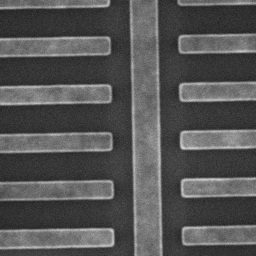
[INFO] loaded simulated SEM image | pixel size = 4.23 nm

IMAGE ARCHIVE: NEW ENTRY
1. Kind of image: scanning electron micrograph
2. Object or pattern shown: groups of lines, slits or small figures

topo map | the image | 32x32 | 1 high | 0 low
11111111111111001111001111111110
00000000000000001111000000000000
00000000000000001111000000000000
00000000000000001111000000000000
00000000000000001111000111111111
11111111111111001111001111111111
11111111111111001111000111111100
00000000000000001111000000000000
00000000000000000111000000000000
00000000000000000111000000000000
00000000000000000111000111111111
11111111111111000111001111111111
11111111111111000111000111111100
00000000000000000111000000000000
00000000000000000111000000000000
00000000000000000111000000000000
00000000000000000111000111111111
11111111111111000111000111111111
11111111111111000111000111111110
00000000000000000111000000000000
00000000000000000111000000000000
00000000000000000111000000000000
00000000000000000111000111111111
11111111111111000111000111111111
11111111111111000111000111111000
00000000000000000111000000000000
00000000000000000111000000000000
00000000000000000111000000000000
00000000000000000111000111111111
11111111111111000111000111111111
11111111111111000111000111111100
00000000000000000111000000000000